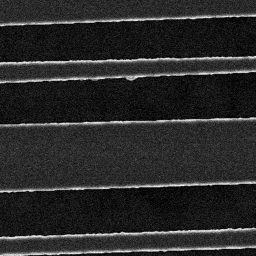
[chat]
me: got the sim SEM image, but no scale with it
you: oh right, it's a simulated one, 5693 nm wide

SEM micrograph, lines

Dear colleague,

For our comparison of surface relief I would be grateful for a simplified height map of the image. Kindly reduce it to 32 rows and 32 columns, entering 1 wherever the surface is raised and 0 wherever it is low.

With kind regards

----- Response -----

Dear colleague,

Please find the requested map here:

11111111111111111111111111111111
11111111111111111111111111111111
11111111111111111100000000000000
00000000000000000000000000000000
00000000000000000000000000000000
00000000000000000000000000000000
00000000000000000000000000000000
00000000000000000111111111111111
11111111111111111111111111111111
11111111111111111100000000000000
00000000000000000000000000000000
00000000000000000000000000000000
00000000000000000000000000000000
00000000000000000000000000000000
00000000000000000000000000000000
00000011111111111111111111111111
11111111111111111111111111111111
11111111111111111111111111111111
11111111111111111111111111111111
11111111111111111111111111111111
11111111111111111111111111111111
11111111111111111111111111111111
11111111111111111111111111111111
11111111111111000000000000000000
00000000000000000000000000000000
00000000000000000000000000000000
00000000000000000000000000000000
00000000000000000000000000000000
00000000000000000000000000000000
00011111111111111111111111111111
11111111111111111111111111111111
11111111111111000000000000000000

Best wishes